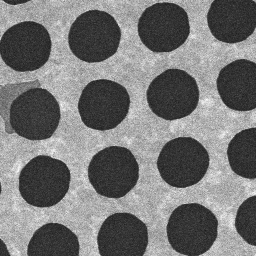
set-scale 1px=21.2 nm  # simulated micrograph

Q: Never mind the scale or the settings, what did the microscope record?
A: a regular array of holes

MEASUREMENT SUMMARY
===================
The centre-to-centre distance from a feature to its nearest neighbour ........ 68.1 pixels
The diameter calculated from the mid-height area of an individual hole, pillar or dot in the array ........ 1100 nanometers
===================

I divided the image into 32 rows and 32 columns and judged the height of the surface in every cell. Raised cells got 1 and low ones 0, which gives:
10011111111111111110001111000000
11111111111001111100000111000000
11111111100000111000000011000000
10000011100000011000000011000000
00000011100000011000000011100001
00000011100000011100000111111111
00000011100000011110011111111111
00000011110001111111111111111101
10000111111111111111111111110000
11111111111111111111000011100000
11111111111000011110000001100000
11100011110000001100000001100000
11000001110000001100000001110000
10000001110000001110000011111000
10000000110000001111000111111111
10000001111000011111111111111111
11000001111111111111111111111100
11110111111111111111100001111000
11111111111110001111000000110000
11111011111100000111000000110000
11100000111000000111000000111000
11100000011000000111000000111000
11000000011000000111000001111111
11000000011100000111111111111111
11100000111110011111111111111111
11110001111111111111111001111100
11111111111111111111110000111100
11111111111110000011100000011000
11111000011110000011100000011000
11110000001100000001100000011100
01110000001100000011100000011110
01100000001100000011110000111111